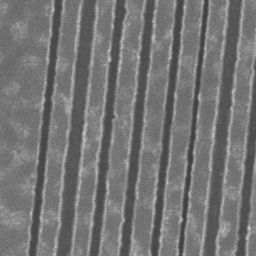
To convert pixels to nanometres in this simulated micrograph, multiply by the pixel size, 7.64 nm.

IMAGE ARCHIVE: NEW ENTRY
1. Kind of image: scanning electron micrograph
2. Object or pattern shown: parallel lines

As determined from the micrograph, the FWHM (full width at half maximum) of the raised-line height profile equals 0.153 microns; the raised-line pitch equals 0.226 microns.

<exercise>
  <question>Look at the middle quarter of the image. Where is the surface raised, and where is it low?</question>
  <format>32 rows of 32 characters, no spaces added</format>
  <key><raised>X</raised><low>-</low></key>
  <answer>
XXX----XXXX---XXXXX--XXXXX---XXX
XX-----XXXX---XXXXX--XXXXX--XXXX
XX-----XXXX--XXXXX---XXXXX--XXXX
XX----XXXXX--XXXXX---XXXXX--XXXX
XX----XXXXX--XXXXX---XXXXX--XXXX
XX----XXXXX--XXXXX---XXXXX--XXXX
XX----XXXXX--XXXXX---XXXXX--XXXX
XX----XXXXX--XXXXX--XXXXXX--XXXX
XX----XXXX---XXXXX--XXXXX---XXXX
XX----XXXX---XXXXX--XXXXX---XXXX
XX----XXXX---XXXX---XXXXX--XXXXX
XX---XXXXX---XXXX---XXXXX--XXXXX
XX---XXXXX---XXXX---XXXXX--XXXXX
X----XXXXX---XXXX---XXXXX--XXXXX
X----XXXXX--XXXXX---XXXXX--XXXXX
XX---XXXXX--XXXXX---XXXXX--XXXXX
X----XXXXX--XXXXX---XXXXX--XXXXX
X----XXXXX--XXXXX---XXXXX--XXXXX
X----XXXX---XXXXX--XXXXX---XXXX-
X----XXXX---XXXXX--XXXXX--XXXXXX
X----XXXX---XXXXX--XXXXXX-XXXXX-
X---XXXXX--XXXXXX--XXXXX--XXXXX-
X---XXXXX--XXXXX---XXXXX--XXXXX-
----XXXXX--XXXXX---XXXXX--XXXXX-
----XXXXX--XXXXX---XXXXX--XXXXX-
----XXXX---XXXXX---XXXXX--XXXXX-
----XXXX---XXXXX---XXXXX--XXXXX-
----XXXX---XXXXX---XXXX---XXXX--
----XXXX---XXXXX--XXXXX--XXXXX--
----XXXX---XXXXX--XXXXX--XXXXX--
----XXXX---XXXXX--XXXXX--XXXXX--
---XXXXX---XXXX---XXXXX--XXXXX-X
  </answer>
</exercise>